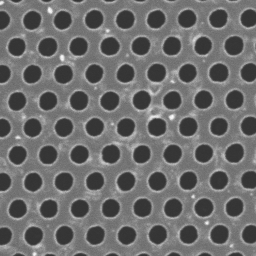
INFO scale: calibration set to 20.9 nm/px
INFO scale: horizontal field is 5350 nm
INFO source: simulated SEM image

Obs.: a regular array of holes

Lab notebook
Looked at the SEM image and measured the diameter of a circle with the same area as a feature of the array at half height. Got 390 nanometers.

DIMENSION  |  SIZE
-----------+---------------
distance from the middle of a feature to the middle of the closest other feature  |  642 nanometres